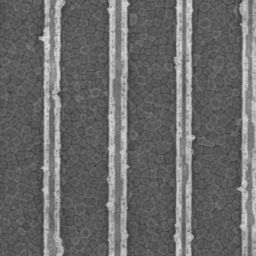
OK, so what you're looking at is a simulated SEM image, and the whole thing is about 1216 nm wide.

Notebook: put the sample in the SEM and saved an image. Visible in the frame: one or a few lines or trenches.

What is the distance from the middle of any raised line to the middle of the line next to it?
0.313 micrometres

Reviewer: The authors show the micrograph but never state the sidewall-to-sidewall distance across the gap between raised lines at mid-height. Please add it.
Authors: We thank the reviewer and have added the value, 52 pixels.